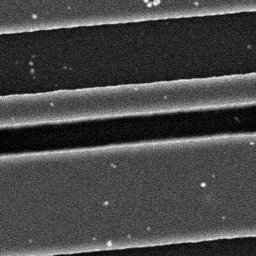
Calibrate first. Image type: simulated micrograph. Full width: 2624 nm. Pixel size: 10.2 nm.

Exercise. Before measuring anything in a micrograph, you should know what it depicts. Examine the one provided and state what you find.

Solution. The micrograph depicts lines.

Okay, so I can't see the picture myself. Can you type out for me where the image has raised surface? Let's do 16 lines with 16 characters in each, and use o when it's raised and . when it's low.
oooooooooooooooo
ooooooo.........
................
................
................
......oooooooooo
ooooooooooooooo.
ooooo...........
..............oo
...ooooooooooooo
oooooooooooooooo
oooooooooooooooo
oooooooooooooooo
oooooooooooooooo
oooooooooooooooo
oooooooo........